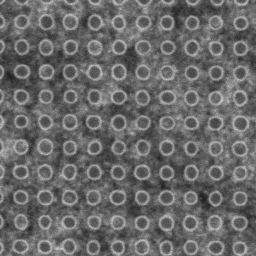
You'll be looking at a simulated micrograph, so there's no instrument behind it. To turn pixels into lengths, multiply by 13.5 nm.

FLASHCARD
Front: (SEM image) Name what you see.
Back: a regular array of raised bodies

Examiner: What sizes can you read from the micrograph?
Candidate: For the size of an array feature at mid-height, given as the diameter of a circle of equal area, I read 184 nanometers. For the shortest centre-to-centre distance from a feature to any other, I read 324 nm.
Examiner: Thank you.